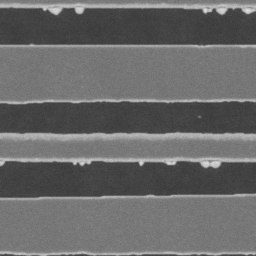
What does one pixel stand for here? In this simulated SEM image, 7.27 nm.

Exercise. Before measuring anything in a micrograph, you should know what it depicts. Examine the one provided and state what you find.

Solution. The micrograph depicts lines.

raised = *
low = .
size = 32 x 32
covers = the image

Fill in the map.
********************************
...........................*....
................................
................................
................................
................................
********************************
********************************
********************************
********************************
********************************
********************************
********************************
................................
................................
................................
................................
********************************
********************************
********************************
.........................***....
................................
................................
................................
..................**.***********
********************************
********************************
********************************
********************************
********************************
********************************
********************************